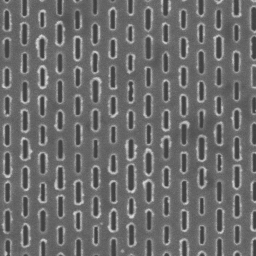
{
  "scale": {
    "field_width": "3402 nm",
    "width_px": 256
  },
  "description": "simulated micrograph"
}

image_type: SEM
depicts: a regular array of holes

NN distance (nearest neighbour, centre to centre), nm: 299